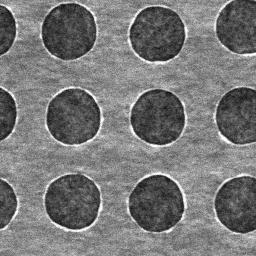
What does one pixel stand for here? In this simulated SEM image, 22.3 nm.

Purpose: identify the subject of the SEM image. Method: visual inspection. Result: holes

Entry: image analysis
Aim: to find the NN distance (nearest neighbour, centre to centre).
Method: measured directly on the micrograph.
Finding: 1880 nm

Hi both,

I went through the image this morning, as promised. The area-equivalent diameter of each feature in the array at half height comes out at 1260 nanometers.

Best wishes